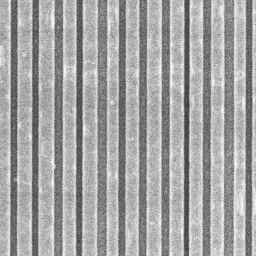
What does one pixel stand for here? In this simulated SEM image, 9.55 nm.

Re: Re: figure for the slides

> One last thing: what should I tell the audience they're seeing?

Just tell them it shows parallel lines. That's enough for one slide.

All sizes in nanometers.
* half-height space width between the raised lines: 72.9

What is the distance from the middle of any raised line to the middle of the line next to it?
206 nm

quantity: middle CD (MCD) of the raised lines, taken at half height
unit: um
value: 0.13